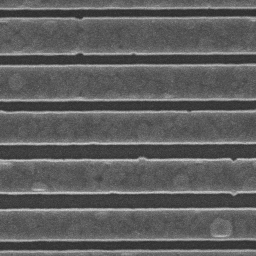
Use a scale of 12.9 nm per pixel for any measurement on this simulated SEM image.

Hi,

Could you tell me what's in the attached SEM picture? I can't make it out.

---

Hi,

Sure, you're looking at parallel lines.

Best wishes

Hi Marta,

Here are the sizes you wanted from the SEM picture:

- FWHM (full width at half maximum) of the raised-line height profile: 433 nm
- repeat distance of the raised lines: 608 nanometres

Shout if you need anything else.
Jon